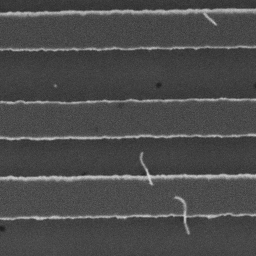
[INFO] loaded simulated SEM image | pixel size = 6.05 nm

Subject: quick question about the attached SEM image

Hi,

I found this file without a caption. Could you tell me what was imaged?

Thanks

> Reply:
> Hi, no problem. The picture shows lines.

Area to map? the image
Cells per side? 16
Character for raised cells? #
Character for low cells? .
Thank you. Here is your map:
................
################
################
................
................
................
################
################
###############.
................
................
################
################
#############...
................
................